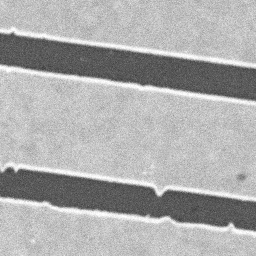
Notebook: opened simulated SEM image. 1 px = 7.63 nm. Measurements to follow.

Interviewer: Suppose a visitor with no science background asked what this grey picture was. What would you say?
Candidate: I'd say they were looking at one or a few lines or trenches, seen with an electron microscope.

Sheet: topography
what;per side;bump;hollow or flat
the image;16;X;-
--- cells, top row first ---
XXXXXXXXXXXXXXXX
XXXXXXXXXXXXXXXX
----XXXXXXXXXXXX
------------XXXX
XX--------------
XXXXXXXXX-------
XXXXXXXXXXXXXXXX
XXXXXXXXXXXXXXXX
XXXXXXXXXXXXXXXX
XXXXXXXXXXXXXXXX
--XXXXXXXXXXXXXX
---------XXXXXXX
----------------
XXXXXXX---------
XXXXXXXXXXXXXXX-
XXXXXXXXXXXXXXXX